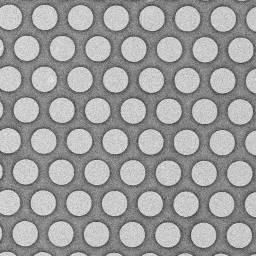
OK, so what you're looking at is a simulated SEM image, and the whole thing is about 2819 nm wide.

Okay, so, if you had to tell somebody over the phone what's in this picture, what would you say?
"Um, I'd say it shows an array of small figures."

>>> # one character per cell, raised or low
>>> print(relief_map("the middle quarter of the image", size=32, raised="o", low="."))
................................
..oooo.....oooo.....oooo.....ooo
.oooooo...oooooo...ooooo....oooo
.oooooo...oooooo...oooooo...oooo
.oooooo...oooooo...oooooo...oooo
.oooooo...oooooo...oooooo...oooo
..oooo.....oooo.....oooo.....ooo
................................
................................
oo....ooooo....oooo.....oooo....
oo....ooooo...oooooo...oooooo...
oo...oooooo...oooooo...oooooo...
oo...oooooo...oooooo...oooooo...
oo....ooooo....ooooo....ooooo...
o......ooo......ooo......ooo....
................................
...oo.......oo..................
.ooooo....ooooo....ooooo....oooo
.oooooo...oooooo...oooooo...oooo
.oooooo...oooooo...oooooo...oooo
.oooooo...oooooo...oooooo...oooo
..oooo....ooooo....ooooo....oooo
..............................oo
................................
o......ooo......ooo......oo.....
oo....ooooo....ooooo....ooooo...
oo...oooooo...oooooo...oooooo...
oo...oooooo...oooooo...oooooo...
oo...oooooo...oooooo...oooooo...
o.....oooo.....oooo.....oooo....
................................
................................